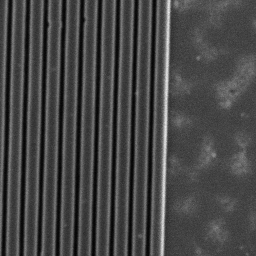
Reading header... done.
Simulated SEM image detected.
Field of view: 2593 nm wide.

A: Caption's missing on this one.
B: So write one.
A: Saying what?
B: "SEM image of parallel lines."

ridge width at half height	129	nm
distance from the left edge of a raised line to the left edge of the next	182	nanometres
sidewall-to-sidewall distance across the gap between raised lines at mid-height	0.0557	um